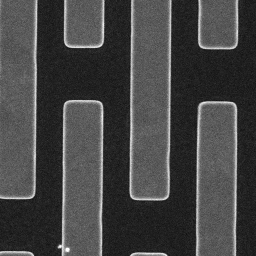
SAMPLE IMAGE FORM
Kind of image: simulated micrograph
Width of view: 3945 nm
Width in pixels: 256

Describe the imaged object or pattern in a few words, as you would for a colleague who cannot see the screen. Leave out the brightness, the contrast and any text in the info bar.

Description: groups of lines, slits or small figures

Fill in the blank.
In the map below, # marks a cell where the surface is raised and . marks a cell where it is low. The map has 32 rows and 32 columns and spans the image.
#####...#####...#####....#####..
#####...#####...#####....#####..
####....#####...#####....#####..
####....#####...#####....#####..
####....#####...#####....#####..
####....#####...#####....#####..
####............#####...........
####............#####...........
####............#####...........
####............#####...........
####............#####...........
####............#####...........
####............#####...........
####....#####...#####....#####..
####....#####...#####....#####..
####....#####...#####....####...
####....#####...#####....#####..
####....#####...#####....#####..
####....#####...#####....#####..
####....#####...#####....#####..
####....#####...#####....#####..
####....#####...#####....#####..
####....#####...#####....#####..
####....#####...#####....####...
####....#####...#####....####...
........#####............####...
........#####............####...
........#####............####...
........#####............####...
........#####............####...
........#####............####...
###.....#####............####...